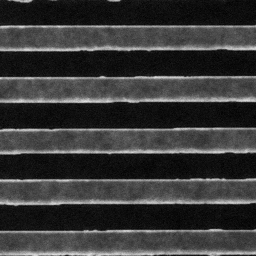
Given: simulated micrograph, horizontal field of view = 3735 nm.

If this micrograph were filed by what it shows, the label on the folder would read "lines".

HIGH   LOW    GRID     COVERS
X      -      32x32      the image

--------------------------------
--------------------------------
--------------------------------
XXXXXXXXXXXXXXXXXXXXXXXXXXXXXXXX
XXXXXXXXXXXXXXXXXXXXXXXXXXXXXXXX
XXXXXXXXXXXXXXXXXXXXXXXXXXXXXXXX
--------------------------------
--------------------------------
--------------------------------
--------------------------------
XXXXXXXXXXXXXXXXXXXXXXXXXXXXXXXX
XXXXXXXXXXXXXXXXXXXXXXXXXXXXXXXX
XXXXXXXXXXXXXXXXXXXXXXXXXXXXXXXX
--------------------------------
--------------------------------
--------------------------------
XXXXXXXXXXXXXXXXXXXXXXXXXXXXXXXX
XXXXXXXXXXXXXXXXXXXXXXXXXXXXXXXX
XXXXXXXXXXXXXXXXXXXXXXXXXXXXXXXX
--------------------------------
--------------------------------
--------------------------------
------------------------XXXX---X
XXXXXXXXXXXXXXXXXXXXXXXXXXXXXXXX
XXXXXXXXXXXXXXXXXXXXXXXXXXXXXXXX
-----X--------------------------
--------------------------------
--------------------------------
--------------------------------
XXXXXXXXXXXXXXXXXXXXXXXXXXXXXXXX
XXXXXXXXXXXXXXXXXXXXXXXXXXXXXXXX
XXXXXXXXXXXXXXXXXXXXXXXXXXXXXXXX